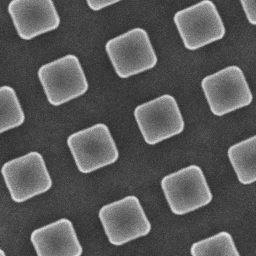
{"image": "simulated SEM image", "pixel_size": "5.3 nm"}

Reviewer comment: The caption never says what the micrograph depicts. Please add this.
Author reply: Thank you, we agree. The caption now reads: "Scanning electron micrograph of a regular array of raised bodies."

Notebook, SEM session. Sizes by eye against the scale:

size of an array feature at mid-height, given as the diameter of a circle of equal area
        240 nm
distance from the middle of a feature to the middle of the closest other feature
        381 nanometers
